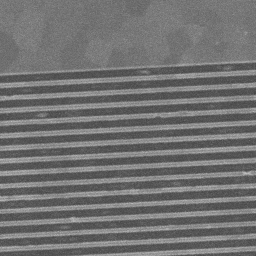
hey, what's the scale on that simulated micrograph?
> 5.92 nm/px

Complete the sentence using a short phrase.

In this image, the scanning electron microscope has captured parallel lines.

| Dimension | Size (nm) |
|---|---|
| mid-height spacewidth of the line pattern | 52.4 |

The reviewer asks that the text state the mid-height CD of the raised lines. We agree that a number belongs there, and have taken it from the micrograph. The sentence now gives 0.0236 µm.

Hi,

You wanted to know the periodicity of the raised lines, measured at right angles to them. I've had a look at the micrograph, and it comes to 74.4 nm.